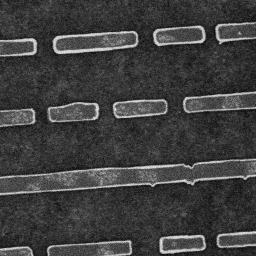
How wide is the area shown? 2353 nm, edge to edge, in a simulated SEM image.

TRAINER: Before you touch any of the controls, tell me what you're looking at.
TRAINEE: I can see one or a few lines or trenches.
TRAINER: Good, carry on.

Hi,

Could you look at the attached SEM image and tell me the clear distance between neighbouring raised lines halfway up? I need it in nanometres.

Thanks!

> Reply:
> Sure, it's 498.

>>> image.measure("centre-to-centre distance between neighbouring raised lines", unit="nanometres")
630